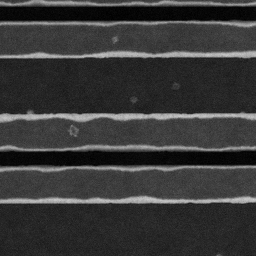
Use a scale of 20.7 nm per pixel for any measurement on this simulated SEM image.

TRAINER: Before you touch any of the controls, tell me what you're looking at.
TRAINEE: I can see lines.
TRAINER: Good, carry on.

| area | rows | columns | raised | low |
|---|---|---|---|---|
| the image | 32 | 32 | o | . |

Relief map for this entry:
oooooooooooooooooooooooooooooooo
................................
................................
oooooooooooooooooooooooooooooooo
oooooooooooooooooooooooooooooooo
oooooooooooooooooooooooooooooooo
oooooooooooooooooooooooooooooooo
................................
................................
................................
................................
................................
................................
................................
oooooooooooooooooooooooooooooooo
oooooooooooooooooooooooooooooooo
oooooooooooooooooooooooooooooooo
oooooooooooooooooooooooooooooooo
oooooooooooooooooooooooooooooooo
................................
................................
oooooooooooooooooooooooooooooooo
oooooooooooooooooooooooooooooooo
oooooooooooooooooooooooooooooooo
oooooooooooooooooooooooooooooooo
................................
................................
................................
................................
................................
................................
................................